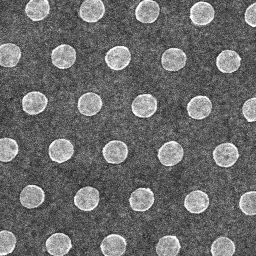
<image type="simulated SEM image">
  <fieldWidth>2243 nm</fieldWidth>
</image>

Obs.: a regular array of raised bodies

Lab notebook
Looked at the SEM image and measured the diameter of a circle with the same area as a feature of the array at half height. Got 209 nanometres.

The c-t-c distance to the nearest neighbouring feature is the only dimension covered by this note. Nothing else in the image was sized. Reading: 54.2 px